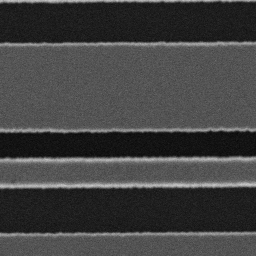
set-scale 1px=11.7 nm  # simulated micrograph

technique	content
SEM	lines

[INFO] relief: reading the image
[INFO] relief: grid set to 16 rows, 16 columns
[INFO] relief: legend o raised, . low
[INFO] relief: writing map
................
................
................
oooooooooooooooo
oooooooooooooooo
oooooooooooooooo
oooooooooooooooo
oooooooooooooooo
................
................
oooooooooooooooo
oooooooooooooooo
................
................
................
oooooooooooooooo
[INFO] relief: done